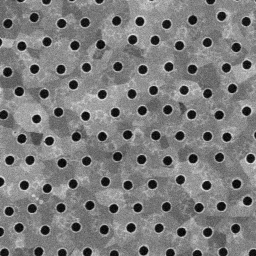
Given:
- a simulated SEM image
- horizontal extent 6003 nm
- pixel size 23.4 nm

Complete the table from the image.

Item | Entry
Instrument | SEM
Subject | a regular array of holes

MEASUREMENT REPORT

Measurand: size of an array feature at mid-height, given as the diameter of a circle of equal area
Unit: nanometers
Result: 237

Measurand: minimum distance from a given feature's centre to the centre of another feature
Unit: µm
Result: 0.542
